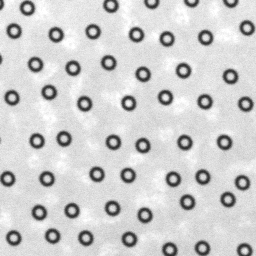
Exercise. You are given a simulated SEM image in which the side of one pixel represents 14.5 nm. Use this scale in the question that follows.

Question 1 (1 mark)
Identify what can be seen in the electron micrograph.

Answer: a regular array of ring-shaped grooves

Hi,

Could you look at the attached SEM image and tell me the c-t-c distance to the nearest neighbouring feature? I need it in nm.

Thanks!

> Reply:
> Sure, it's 451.